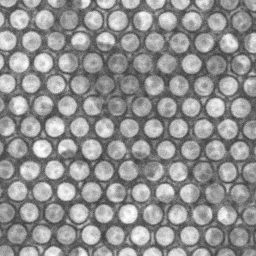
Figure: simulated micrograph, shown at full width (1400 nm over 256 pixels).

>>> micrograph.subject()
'a regular array of raised bodies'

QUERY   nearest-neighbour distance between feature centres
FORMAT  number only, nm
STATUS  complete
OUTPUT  133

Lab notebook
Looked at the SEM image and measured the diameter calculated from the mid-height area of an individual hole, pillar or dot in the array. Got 99.6 nanometers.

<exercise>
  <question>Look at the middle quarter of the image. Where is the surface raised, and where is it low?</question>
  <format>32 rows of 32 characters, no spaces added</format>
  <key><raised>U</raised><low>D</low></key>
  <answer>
UUUDDUUUUDDUUUUUDDUUUUDDUUUUDDUU
UUDDDDUUUDDDUUUDDDUUUDDDUUUDDDUU
DDDDDDDDDDDDDDDDDDDDDDDDDDDDDDDD
DDDUUDDDDUUUDDDUUUDDDUUUDDDUUUDD
DDUUUUDDUUUUDDUUUUUDUUUUUDDUUUUD
DDUUUUDDUUUUDDUUUUUDUUUUUDDUUUUD
DDUUUUDDDUUUDDDUUUDDUUUUUDDUUUUD
DDDDDDDDDDDDDDDDDDDDDDUDDDDDUUDD
UUDDDDUUDDDDDDDDDDDUDDDDDDDDDDDD
UUUDDUUUUDDUUUUDDDUUUDDDUUUUDDUU
UUUDDUUUUDDUUUUDDUUUUUDUUUUUDDUU
UUUDDUUUUDDUUUUDDUUUUUDDUUUUDDUU
UUDDDDUUDDDDUUDDDDUUUDDDUUUDDDUU
DDDDDDDDDDDDDDDDDDDDDDDDDDDDDDDD
DDUUUUDDUUUUDDDUUUDDDUUUDDDUUUDD
DDUUUUDDUUUUDDUUUUUDUUUUUDDUUUUD
DDUUUUDDUUUUDDUUUUUDUUUUDDDUUUUD
DDDUUDDDDUUUDDDUUUDDDUUUDDDUUUDD
DDDDDDDDDDDDDDDDDDDDDDDDDDDDDDDD
UUDDDUUUDDDDUUDDDDUUDDDDDUDDDDDU
UUUDDUUUUDDUUUUDDUUUUDDDUUUDDDUU
UUUDDUUUUDDUUUUDDUUUUDDDUUUUDDUU
UUUDDUUUUDDUUUUDDUUUUDDDUUUDDDUU
DDDDDDUUDDDDUUDDDDUUDDDDDUDDDDDU
DDDUUDDDDDDDDDDUUDDDDDDDDDDDDDDD
DDUUUUDDUUUUDDUUUUDDUUUUDDDUUUDD
DDUUUUDDUUUUDDUUUUDDUUUUUDUUUUUD
DDUUUUDDUUUUDDUUUUDDUUUUUDUUUUUD
DDDUUDDDDUUDDDUUUUDDDUUUDDDUUUDD
DDDDDDDDDDDDDDDDDDDDDDDDDDDDDDDD
UUDDDUUUUDDUUUUDDDUUUDDDUUDDDDDU
UUUDDUUUUDDUUUUDDUUUUDDUUUUDDUUU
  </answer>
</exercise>